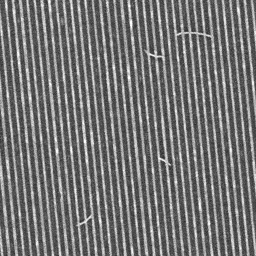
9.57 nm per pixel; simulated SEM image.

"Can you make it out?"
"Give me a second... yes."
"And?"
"parallel lines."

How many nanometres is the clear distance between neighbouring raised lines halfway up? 50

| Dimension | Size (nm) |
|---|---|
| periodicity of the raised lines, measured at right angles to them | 69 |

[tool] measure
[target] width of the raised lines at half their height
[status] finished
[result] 14.3 nanometers